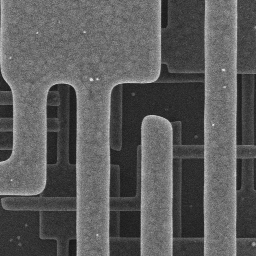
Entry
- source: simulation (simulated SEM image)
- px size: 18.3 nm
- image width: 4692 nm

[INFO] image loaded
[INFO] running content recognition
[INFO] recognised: wiring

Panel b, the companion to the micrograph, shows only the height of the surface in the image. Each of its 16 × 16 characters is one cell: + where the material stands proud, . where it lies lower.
++++++++++...++.
++++++++++...++.
++++++++++...++.
++++++++++...++.
++++++++++...++.
.++.+++......++.
.++..++......++.
.++..++..+...++.
.++..++..++..++.
.++..++..++..++.
+++..++..++..++.
+++..++..++..++.
.....++..++..++.
.....++..++..++.
.....++..++..++.
.....++..++..++.